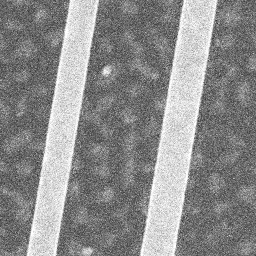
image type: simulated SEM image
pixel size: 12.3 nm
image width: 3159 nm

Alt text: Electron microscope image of one or a few lines or trenches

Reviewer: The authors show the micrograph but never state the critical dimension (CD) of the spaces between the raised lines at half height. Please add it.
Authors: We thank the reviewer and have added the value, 1050 nanometres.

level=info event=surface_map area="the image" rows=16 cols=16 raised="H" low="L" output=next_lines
LLLLHHLLLLLHHLLL
LLLLHHLLLLLHHLLL
LLLLHHLLLLLHHLLL
LLLLHHLLLLLHHLLL
LLLLHLLLLLLHHLLL
LLLHHLLLLLLHHLLL
LLLHHLLLLLHHLLLL
LLLHHLLLLLHHLLLL
LLLHHLLLLLHHLLLL
LLLHHLLLLLHHLLLL
LLLHLLLLLLHHLLLL
LLHHLLLLLLHHLLLL
LLHHLLLLLHHLLLLL
LLHHLLLLLHHLLLLL
LLHHLLLLLHHLLLLL
LLHHLLLLLHHLLLLL